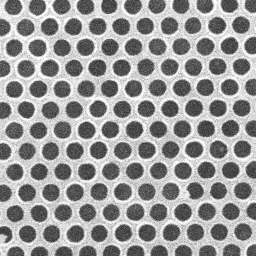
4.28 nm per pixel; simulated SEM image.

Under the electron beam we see a regular array of holes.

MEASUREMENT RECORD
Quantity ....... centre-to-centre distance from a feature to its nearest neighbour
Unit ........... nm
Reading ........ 101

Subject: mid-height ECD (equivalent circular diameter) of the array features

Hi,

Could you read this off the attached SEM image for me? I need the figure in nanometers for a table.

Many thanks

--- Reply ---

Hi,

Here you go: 76